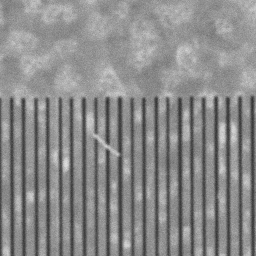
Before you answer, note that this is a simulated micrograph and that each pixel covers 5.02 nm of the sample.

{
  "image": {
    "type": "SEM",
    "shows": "parallel lines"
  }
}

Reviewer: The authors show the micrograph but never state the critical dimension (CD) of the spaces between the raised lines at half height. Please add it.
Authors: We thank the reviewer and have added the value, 0.0176 micrometres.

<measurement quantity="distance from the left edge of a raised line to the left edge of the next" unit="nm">60.4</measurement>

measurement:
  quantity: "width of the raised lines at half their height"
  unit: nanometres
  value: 43.3